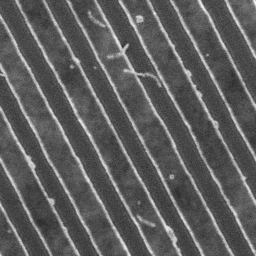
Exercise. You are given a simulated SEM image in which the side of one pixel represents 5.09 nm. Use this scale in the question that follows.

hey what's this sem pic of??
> lines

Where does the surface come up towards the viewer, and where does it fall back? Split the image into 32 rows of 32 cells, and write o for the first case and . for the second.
..oooo...ooo...oooo...ooo...oooo
...ooo...oooo...ooo...oooo...ooo
...oooo...ooo...oooo...ooo...ooo
o...ooo...oooo...ooo...oooo...oo
o...oooo...ooo...oooo...ooo...oo
oo...ooo...oooo...oooo..oooo...o
oo...oooo...oooo..oooo...oooo...
ooo...oooo..oooo...oooo..oooo...
oooo..oooo...oooo..oooo...oooo..
.ooo...oooo..oooo...oooo..oooo..
.oooo...ooo...oooo..oooo...ooo..
..ooo...oooo..oooo...oooo..oooo.
..oooo...ooo...oooo...ooo...oooo
...ooo...oooo..oooo...oooo...ooo
o..oooo...ooo...oooo...ooo...ooo
o...ooo...oooo...ooo...oooo..ooo
oo..oooo...ooo...oooo...ooo...oo
oo...ooo...oooo...oooo..oooo...o
ooo..oooo...ooo...oooo...ooo...o
ooo...oooo..oooo...ooo...oooo...
oooo..oooo...oooo..oooo...oooo..
.ooo...oooo..oooo...ooo...oooo..
.oooo..oooo...oooo..oooo...ooo..
..ooo...oooo..oooo...oooo..oooo.
..oooo...ooo...oooo..oooo...oooo
...oooo..oooo..oooo...oooo...ooo
o..oooo...ooo...oooo..oooo...ooo
o...oooo..oooo...ooo...oooo...oo
oo..oooo...ooo...oooo..oooo...oo
oo...oooo..oooo...oooo..oooo...o
ooo...ooo...oooo..oooo...ooo...o
ooo...oooo..oooo...ooo...oooo...